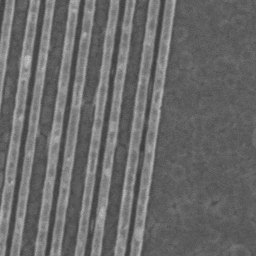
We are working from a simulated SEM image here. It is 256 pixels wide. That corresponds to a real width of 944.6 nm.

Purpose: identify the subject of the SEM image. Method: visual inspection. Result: parallel lines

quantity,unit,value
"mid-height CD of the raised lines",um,0.0329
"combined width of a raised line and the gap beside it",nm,71.7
